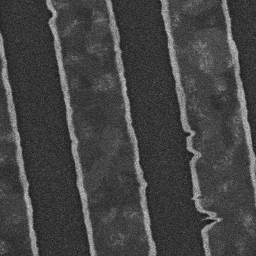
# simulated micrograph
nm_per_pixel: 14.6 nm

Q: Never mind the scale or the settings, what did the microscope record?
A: one or a few lines or trenches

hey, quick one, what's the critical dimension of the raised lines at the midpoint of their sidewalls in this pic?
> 860 nanometres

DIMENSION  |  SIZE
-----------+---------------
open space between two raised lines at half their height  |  801 nm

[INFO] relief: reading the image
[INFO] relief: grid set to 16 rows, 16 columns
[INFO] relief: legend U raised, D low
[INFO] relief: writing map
DDDUUUUDDDUUUUDD
DDDUUUUDDDUUUUDD
DDDDUUUDDDDUUUDD
DDDDUUUDDDDUUUUD
DDDDUUUUDDDUUUUD
UDDDUUUUDDDUUUUD
UDDDUUUUDDDUUUUD
UDDDUUUUDDDDUUUD
UDDDDUUUDDDDUUUU
UDDDDUUUUDDDUUUU
UDDDDUUUUDDDUUUU
UUDDDUUUUDDDUUUU
UUDDDUUUUDDDUUUU
UUDDDUUUUDDDDUUU
UUDDDDUUUDDDDUUU
UUDDDDUUUDDDDUUU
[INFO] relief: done